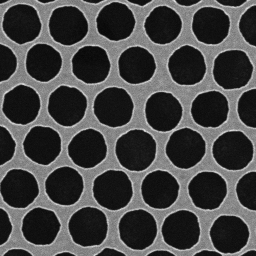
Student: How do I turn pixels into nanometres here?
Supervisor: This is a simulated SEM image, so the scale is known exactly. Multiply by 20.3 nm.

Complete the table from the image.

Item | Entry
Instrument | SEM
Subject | a regular array of holes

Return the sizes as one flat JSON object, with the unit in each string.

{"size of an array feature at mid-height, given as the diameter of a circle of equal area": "0.788 µm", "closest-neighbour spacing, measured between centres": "0.922 um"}